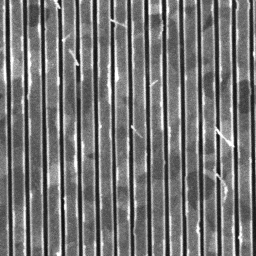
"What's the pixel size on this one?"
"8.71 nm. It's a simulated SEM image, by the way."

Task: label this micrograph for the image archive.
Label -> parallel lines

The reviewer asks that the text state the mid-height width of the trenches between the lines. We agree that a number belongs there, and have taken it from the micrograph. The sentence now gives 0.0425 microns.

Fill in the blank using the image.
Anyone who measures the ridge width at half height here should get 103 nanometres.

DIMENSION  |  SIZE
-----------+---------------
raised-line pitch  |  152 nanometers